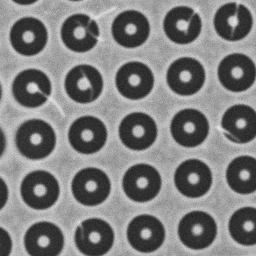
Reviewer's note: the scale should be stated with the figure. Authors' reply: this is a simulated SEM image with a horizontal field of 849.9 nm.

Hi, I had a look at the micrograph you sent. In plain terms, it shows an array of small figures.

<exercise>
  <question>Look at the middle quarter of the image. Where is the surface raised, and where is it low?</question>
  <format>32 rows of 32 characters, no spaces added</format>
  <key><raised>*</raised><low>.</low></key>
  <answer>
**.....*******.......*****......
*........****.........****......
*........****.........***....**.
.....*....***...***....**....***
....**....***....**....***......
....**....***.........****......
..........***.........****......
*........*****.......*******....
*........******.....************
***....*************************
********************************
*****************************...
****************.....*******....
***......******.......*****.....
**........****.........****.....
**........****.........***....**
*..........**....***...****...**
*...***....***...***....***.....
*....**....***.........****.....
*..........***.........*****....
**........*****.......*******...
**.......********...************
****...*************************
********************************
*****************************...
*****************.....*******...
****......******.......*****....
***........****.........****....
**.........****.........***....*
**....*.....**....***....**.....
**....**....**.....*....****....
**....*.....***.........****....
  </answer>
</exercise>